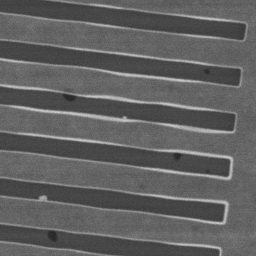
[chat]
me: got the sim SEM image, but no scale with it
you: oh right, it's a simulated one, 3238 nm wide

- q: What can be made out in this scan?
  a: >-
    groups of lines, slits or small figures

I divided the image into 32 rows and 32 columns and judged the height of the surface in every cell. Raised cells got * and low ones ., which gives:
..........**********************
..................**************
********....................****
****************...............*
************************.......*
.....***************************
.............*******************
*....................***********
***********...................**
******************............**
***************************...**
........************************
................****************
***.....................********
***********..................***
*********************........***
****************************.***
.........***********************
.................***************
******.....................*****
***************..............***
*********************........***
..******************************
...........*********************
....................************
*********...................****
******************..........****
************************....****
.....***************************
.............*******************
***..................***********
***********................*****